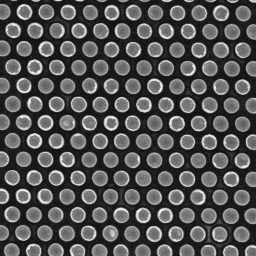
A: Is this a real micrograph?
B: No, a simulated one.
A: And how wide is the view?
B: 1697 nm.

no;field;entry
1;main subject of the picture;a regular array of raised bodies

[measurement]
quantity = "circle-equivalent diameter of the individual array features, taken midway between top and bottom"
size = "101 nm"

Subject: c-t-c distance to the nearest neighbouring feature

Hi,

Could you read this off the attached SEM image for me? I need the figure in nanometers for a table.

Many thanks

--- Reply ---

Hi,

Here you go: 140